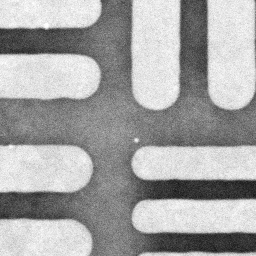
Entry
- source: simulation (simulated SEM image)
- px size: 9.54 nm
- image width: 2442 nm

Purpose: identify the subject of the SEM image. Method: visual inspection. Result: groups of lines, slits or small figures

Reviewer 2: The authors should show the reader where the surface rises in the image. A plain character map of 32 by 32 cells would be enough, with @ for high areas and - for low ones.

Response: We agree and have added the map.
@@@@@@@@@@@@@----@@@@@----@@@@@@
@@@@@@@@@@@@@----@@@@@----@@@@@@
@@@@@@@@@@@@-----@@@@@----@@@@@@
-----------------@@@@@----@@@@@@
-----------------@@@@@----@@@@@@
-----------------@@@@@----@@@@@@
-----------------@@@@@----@@@@@@
@@@@@@@@@@@@-----@@@@@----@@@@@@
@@@@@@@@@@@@-----@@@@@----@@@@@@
@@@@@@@@@@@@-----@@@@@----@@@@@@
@@@@@@@@@@@@-----@@@@@----@@@@@@
@@@@@@@@@@@@-----@@@@@----@@@@@@
-----------------@@@@@-----@@@@-
-------------------@@-------@@--
--------------------------------
--------------------------------
--------------------------------
--------------------------------
@@@@@@@@@@--------@@@@@@@@@@@@@@
@@@@@@@@@@@------@@@@@@@@@@@@@@@
@@@@@@@@@@@------@@@@@@@@@@@@@@@
@@@@@@@@@@@------@@@@@@@@@@@@@@@
@@@@@@@@@@@---------------------
@@@@@@@@@@----------------------
--------------------------------
-----------------@@@@@@@@@@@@@@@
-----------------@@@@@@@@@@@@@@@
@@@@@--@@--------@@@@@@@@@@@@@@@
@@@@@@@@@@@------@@@@@@@@@@@@@@@
@@@@@@@@@@@---------------------
@@@@@@@@@@@---------------------
@@@@@@@@@@@---------------------